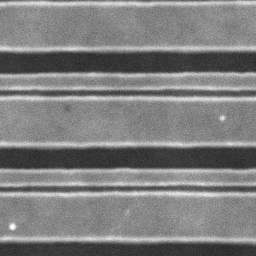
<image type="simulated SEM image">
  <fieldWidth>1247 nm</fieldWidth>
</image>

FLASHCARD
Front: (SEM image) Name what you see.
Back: lines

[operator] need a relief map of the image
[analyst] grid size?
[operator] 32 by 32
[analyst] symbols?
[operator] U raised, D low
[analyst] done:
UUUUUUUUUUUUUUUUUUUUUUUUUUUUUUUU
UUUUUUUUUUUUUUUUUUUUUUUUUUUUUUUU
UUUUUUUUUUUUUUUUUUUUUUUUUUUUUUUU
UUUUUUUUUUUUUUUUUUUUUUUUUUUUUUUU
UUUUUUUUUUUUUUUUUUUUUUUUUUUUUUUU
UUUUUUUUUUUUUUUUUUUUUUUUUUUUUUUU
DDDDDDDDDDDDDDDDDDDDDDDDDDDDDDDD
DDDDDDDDDDDDDDDDDDDDDDDDDDDDDDDD
DDDDDDDDDDDDDDDDDDDDDDDDDDDDDDDD
UUUUUUUUUUUUUUUUUUUUUUUUUUUUUUUU
UUUUUUUUUUUUUUUUUUUUUUUUUUUUUUUU
UUUUUUUUUUUUUUUUUUUUUUUUUUUUUUUU
UUUUUUUUUUUUUUUUUUUUUUUUUUUUUUUU
UUUUUUUUUUUUUUUUUUUUUUUUUUUUUUUU
UUUUUUUUUUUUUUUUUUUUUUUUUUUUUUUU
UUUUUUUUUUUUUUUUUUUUUUUUUUUUUUUU
UUUUUUUUUUUUUUUUUUUUUUUUUUUUUUUU
UUUUUUUUUUUUUUUUUUUUUUUUUUUUUUUU
DDDDDDDDDDDDDDDDDDDDDDDDDDDDDDDD
DDDDDDDDDDDDDDDDDDDDDDDDDDDDDDDD
DDDDDDDDDDDDDDDDDDDDDDDDDDDDDDDD
UUUUUUUUUUUUUUUUUUUUUUUUUUUUUUUU
UUUUUUUUUUUUUUUUUUUUUUUUUUUUUUUU
UUUUUUUUUUUUUUUUUUUUUUUUUUUUUUUU
UUUUUUUUUUUUUUUUUUUUUUUUUUUUUUUU
UUUUUUUUUUUUUUUUUUUUUUUUUUUUUUUU
UUUUUUUUUUUUUUUUUUUUUUUUUUUUUUUU
UUUUUUUUUUUUUUUUUUUUUUUUUUUUUUUU
UUUUUUUUUUUUUUUUUUUUUUUUUUUUUUUU
UUUUUUUUUUUUUUUUUUUUUUUUUUUUUUUU
DDDDDDDDDDDDDDDDDDDDDDDDDDDDDDDD
DDDDDDDDDDDDDDDDDDDDDDDDDDDDDDDD